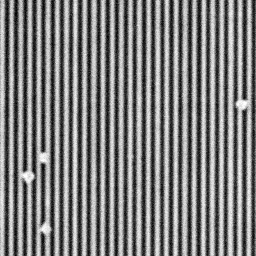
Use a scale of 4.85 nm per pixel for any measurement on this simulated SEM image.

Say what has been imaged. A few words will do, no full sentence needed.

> parallel lines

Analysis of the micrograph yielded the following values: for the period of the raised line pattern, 44.4 nm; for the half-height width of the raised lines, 0.0188 um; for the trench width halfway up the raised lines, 23 nm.